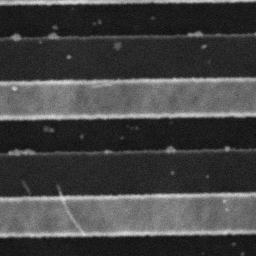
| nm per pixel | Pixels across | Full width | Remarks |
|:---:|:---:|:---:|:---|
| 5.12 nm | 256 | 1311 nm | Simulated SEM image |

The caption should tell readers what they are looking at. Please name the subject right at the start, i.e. lines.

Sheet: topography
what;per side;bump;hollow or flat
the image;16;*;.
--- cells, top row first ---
................
................
................
................
................
****************
****************
................
................
................
................
................
****************
****************
****************
................